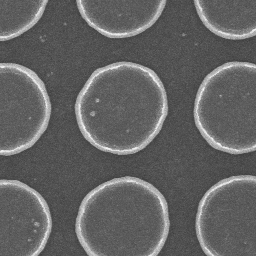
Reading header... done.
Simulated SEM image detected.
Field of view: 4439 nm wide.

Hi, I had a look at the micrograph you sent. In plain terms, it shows raised bodies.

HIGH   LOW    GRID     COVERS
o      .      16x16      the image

ooo..ooooo..oooo
oo....ooo....ooo
................
................
oo....ooo....ooo
ooo..ooooo...ooo
ooo..ooooo..oooo
ooo..ooooo..oooo
oo...ooooo...ooo
o......o........
................
o......oo.....oo
ooo..ooooo...ooo
ooo..ooooo..oooo
ooo..ooooo..oooo
ooo..ooooo...ooo